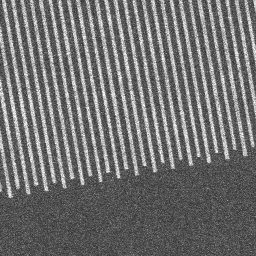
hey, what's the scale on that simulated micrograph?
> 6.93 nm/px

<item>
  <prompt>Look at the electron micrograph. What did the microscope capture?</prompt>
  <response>parallel lines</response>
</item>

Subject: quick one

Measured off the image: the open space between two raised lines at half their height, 40.1 nanometers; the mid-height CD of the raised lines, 20.4 nm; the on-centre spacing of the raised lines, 0.0635 microns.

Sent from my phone